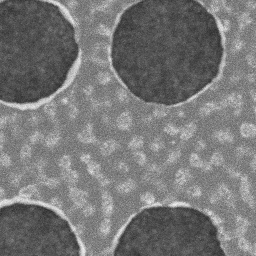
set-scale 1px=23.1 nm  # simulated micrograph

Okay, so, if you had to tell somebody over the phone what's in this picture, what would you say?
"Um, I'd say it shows holes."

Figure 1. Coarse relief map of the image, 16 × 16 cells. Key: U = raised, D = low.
DDDDUUUUDDDDDUUU
DDDDUUUDDDDDDDUU
DDDDDUUDDDDDDDUU
DDDDDUUDDDDDDDUU
DDDDDUUDDDDDDDUU
DDDDUUUUDDDDDUUU
UUUUUUUUUUDUUUUU
UUUUUUUUUUUUUUUU
UUUUUUUUUUUUUUUU
UUUUUUUUUUUUUUUU
UUUUUUUUUUUUUUUU
UUUUUUUUUUUUUUUU
UUUUUUUUUUUUUUUU
DDDDUUUUDDDDDUUU
DDDDDUUUDDDDDDUU
DDDDDUUDDDDDDDUU